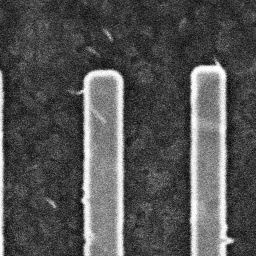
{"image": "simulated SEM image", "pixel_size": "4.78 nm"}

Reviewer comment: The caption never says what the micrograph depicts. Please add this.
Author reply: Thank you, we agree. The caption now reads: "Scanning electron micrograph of one or a few lines or trenches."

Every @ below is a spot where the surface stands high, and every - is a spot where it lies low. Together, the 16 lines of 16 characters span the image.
----------------
----------------
----------------
----------------
------------@@--
-----@@@----@@--
-----@@@----@@--
-----@@@----@@--
-----@@@----@@--
-----@@@----@@--
-----@@@----@@--
-----@@@----@@--
-----@@@----@@--
-----@@@----@@--
-----@@@----@@--
-----@@@----@@--